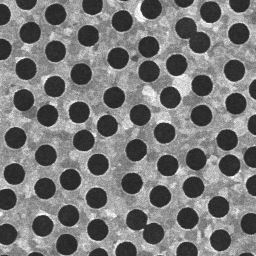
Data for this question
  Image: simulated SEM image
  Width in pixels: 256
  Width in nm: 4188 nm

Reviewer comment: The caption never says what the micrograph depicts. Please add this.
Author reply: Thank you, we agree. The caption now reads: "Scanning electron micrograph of a regular array of holes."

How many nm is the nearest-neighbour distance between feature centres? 495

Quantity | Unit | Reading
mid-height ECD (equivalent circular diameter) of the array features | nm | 359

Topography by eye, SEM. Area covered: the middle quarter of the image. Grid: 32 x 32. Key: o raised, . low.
oo....oooooo...oooo.....o......o
oo.....oooooooooooo.....oo.....o
oo.....oooooooooooo.....oo....oo
oo.....oooooooooooo....ooooooooo
oo....oooooooooooooo..oooooooooo
oooooooooooooooooooooooooooooooo
ooooooooooo....oooooooooo....ooo
oooooooooo.....ooooooooo.....ooo
oooooooooo.....ooooooooo.....ooo
ooo..ooooo.....ooooooooo.....ooo
oo....ooooo...ooo....oooo...oooo
o.....ooooooooooo....ooooooooooo
o.....oooooooooo......oooooooooo
o.....ooo....ooo......oooooooooo
oo...ooo.....oooo....ooooooooooo
oooooooo......ooooo.ooo....ooooo
oooo..oo.....ooooooooo......oooo
ooo....oo....ooooooooo......oooo
oo......ooooooooooooooo.....oooo
oo......oooooooo....oooo...ooooo
oo.....ooooooooo.....ooooooooooo
ooo...ooooooooo......ooooooooooo
oooooooo.oooooo......oooooooooo.
oooooo.....ooooo....oooo....oo..
oooooo.....oooooooooooo......o..
oooooo.....oooooooooooo......oo.
...ooo.....oooooooooooo.....oooo
....ooo...ooooo...oooooo....oooo
....ooooooooooo....oooooooooooo.
....oooooooooo......oooooooooo..
....oooooooooo......ooo..ooooo..
o..ooo....ooooo....ooo....oooo..